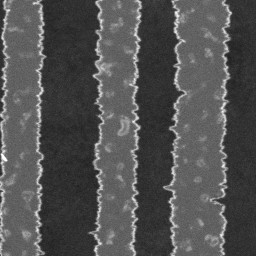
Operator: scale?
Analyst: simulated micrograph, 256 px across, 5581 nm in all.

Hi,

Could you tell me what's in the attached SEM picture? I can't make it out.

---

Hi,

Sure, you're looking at one or a few lines or trenches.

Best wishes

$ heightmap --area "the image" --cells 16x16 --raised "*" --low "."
...***...**...**
...***...**...**
...***...**...**
...***..***...**
..****...**...**
..****..***...**
..****..***...**
..****..***...**
..****...**...**
..****..***...**
..****..***...**
..****..***...**
..****..***...**
..****..***...**
..****..***...**
..****..***...**